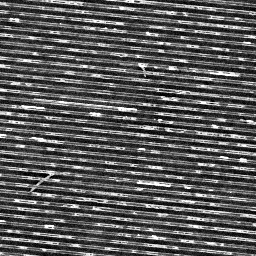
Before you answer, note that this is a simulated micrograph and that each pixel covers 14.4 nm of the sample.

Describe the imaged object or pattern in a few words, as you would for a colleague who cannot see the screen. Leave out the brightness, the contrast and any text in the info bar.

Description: parallel lines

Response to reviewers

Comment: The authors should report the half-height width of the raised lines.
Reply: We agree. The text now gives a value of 41.3 nm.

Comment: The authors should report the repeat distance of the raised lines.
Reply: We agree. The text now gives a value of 112 nm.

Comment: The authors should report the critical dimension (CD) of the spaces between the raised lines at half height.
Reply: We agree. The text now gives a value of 70.1 nm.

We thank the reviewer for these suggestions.